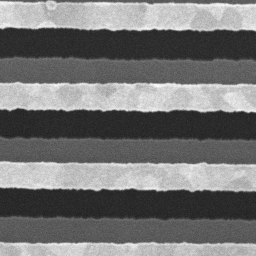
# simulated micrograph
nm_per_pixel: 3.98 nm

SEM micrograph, lines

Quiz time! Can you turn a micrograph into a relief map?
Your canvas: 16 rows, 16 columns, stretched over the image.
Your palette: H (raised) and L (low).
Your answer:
HHHHHHHHHHHHHHHH
HHHHHHHHHHHHHHHH
LLLLLLLLLLLLLLLL
LLLLLLLLLLLLLLLL
HHHHHHHHHHHHHHHH
HHHHHHHHHHHHHHHH
HHHHHHHHHHHHHHHH
LLLLLLLLLLLLLLLL
LLLLLLLLLLLLLLLL
HHHHHHHHHHHHHHHH
HHHHHHHHHHHHHHHH
HHHHHHHHHHHHHHHH
LLLLLLLLLLLLLLLL
LLLLLLLLLLLLLLLL
HHHHHHHHHHHHHHHH
HHHHHHHHHHHHHHHH